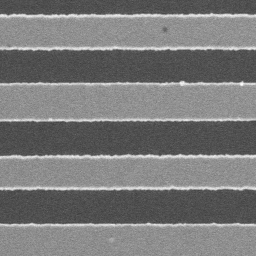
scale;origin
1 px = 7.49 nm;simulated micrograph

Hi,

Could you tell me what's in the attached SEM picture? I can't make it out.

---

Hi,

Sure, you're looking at lines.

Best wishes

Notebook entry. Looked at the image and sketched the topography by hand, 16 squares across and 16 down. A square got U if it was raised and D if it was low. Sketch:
DDDDDDDDDDDDDDDD
UUUUUUUUUUUUUUUU
UUUUUUUUUUUUUUUU
DDDDDDDDDDDDDDDD
DDDDDDDDDDDDDDDD
UUUUUUUUUUUUUUUU
UUUUUUUUUUUUUUUU
UUUUUUUUUUUUUUUU
DDDDDDDDDDDDDDDD
DDDDDDDDDDDDDDDD
UUUUUUUUUUUUUUUU
UUUUUUUUUUUUUUUU
DDDDDDDDDDDDDDDD
DDDDDDDDDDDDDDDD
UUUUUUUUUUUUUUUU
UUUUUUUUUUUUUUUU